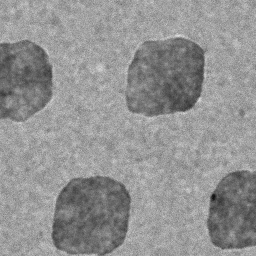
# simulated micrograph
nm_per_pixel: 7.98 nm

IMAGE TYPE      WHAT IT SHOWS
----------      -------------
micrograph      holes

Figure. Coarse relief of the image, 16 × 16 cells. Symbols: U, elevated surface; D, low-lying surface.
UUUUUUUUUUUUUUUU
UUUUUUUUUUUUUUUU
UUUUUUUUUDDDUUUU
DDDUUUUUDDDDDUUU
DDDUUUUUDDDDDUUU
DDDUUUUUDDDDDUUU
DDDUUUUUDDDDUUUU
DDUUUUUUUUUUUUUU
UUUUUUUUUUUUUUUU
UUUUUUUUUUUUUUUU
UUUUUUUUUUUUUUUU
UUUUDDDDUUUUUUDD
UUUDDDDDUUUUUDDD
UUUDDDDDUUUUUDDD
UUUDDDDDUUUUUDDD
UUUUDDDUUUUUUUDD